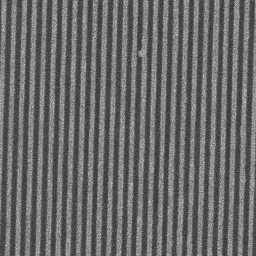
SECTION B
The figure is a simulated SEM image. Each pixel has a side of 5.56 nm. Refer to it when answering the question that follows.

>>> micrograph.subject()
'parallel lines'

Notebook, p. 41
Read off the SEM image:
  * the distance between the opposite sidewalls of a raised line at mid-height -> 0.0299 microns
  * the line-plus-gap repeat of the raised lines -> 56.2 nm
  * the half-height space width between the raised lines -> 0.025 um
